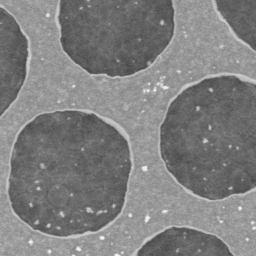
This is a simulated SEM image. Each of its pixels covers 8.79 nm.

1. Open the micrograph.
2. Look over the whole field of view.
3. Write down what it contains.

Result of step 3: holes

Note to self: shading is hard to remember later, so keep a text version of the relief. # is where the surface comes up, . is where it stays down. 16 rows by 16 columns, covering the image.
####.......###..
.###.......###..
..##.......####.
..##......######
..####...#######
.###########....
.##########.....
##.....###......
#.......##......
#.......##......
#.......##......
#.......###.....
#.......########
#......#########
###...####...###
#########.....##